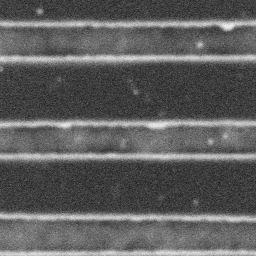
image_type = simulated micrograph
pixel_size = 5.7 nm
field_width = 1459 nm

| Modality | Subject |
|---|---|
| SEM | lines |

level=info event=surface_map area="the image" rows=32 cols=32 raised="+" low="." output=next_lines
++++++++++++++++++++++++++++++++
++++++++++++++++++++++++++++++++
++++++++++++++++++++++++++++++++
................................
................................
................................
................................
++++++++++++++++++++++++++++++++
++++++++++++++++++++++++++++++++
++++++++++++++++++++++++++++++++
++++++++++++++++++++++++++++++++
++++++++++++++++++++++++++++++++
++++++++++++++++++++++++++++++++
++++++++++++++++++++++++++++++++
++++++++++++++++++++++++++++++++
+++++++++++++++++++++++++++..+++
................................
................................
................................
++++++++++++++++++++++++++++++++
++++++++++++++++++++++++++++++++
++++++++++++++++++++++++++++++++
++++++++++++++++++++++++++++++++
++++++++++++++++++++++++++++++++
++++++++++++++++++++++++++++++++
++++++++++++++++++++++++++++++++
++++++++++++++++++++++++++++++++
.............................+.+
................................
................................
................................
.............+..++.+++++++++++++